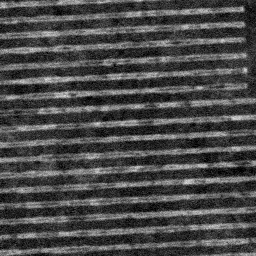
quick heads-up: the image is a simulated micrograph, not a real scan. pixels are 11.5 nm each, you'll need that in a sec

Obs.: parallel lines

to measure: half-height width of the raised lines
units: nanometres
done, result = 41.6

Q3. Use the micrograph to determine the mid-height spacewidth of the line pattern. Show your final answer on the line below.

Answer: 11.9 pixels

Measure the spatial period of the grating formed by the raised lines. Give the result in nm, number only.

178